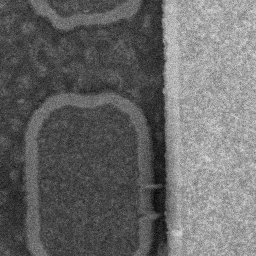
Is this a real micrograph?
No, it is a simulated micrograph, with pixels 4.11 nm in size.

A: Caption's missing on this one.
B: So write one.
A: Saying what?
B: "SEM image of one or a few lines or trenches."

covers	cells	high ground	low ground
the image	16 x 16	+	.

...+++++...+++++
...........+++++
...........+++++
...........+++++
...........+++++
...........+++++
...+++++...+++++
..+++++++..+++++
..+++++++..+++++
..+++++++..+++++
..+++++++..+++++
..+++++++..+++++
..+++++++..+++++
..+++++++..+++++
..+++++++..+++++
..+++++++..+++++